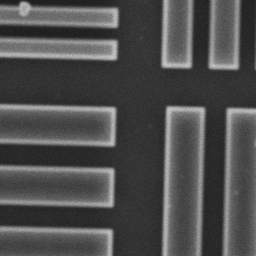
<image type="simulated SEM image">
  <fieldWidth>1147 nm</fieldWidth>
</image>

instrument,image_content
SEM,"groups of lines, slits or small figures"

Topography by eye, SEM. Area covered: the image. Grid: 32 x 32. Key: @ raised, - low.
---------------------@@@---@@@--
@@@@@@@@@@@@@@-------@@@--@@@@--
@@@@@@@@@@@@@@-------@@@--@@@@--
---------------------@@@--@@@@--
---------------------@@@--@@@@--
@@@@@@@@@@@@@@------@@@@--@@@@--
@@@@@@@@@@@@@@------@@@@--@@@@--
--------------------@@@@--@@@@--
--------------------------------
--------------------------------
--------------------------------
--------------------------------
--------------------------------
@@@@@@@-------------------------
@@@@@@@@@@@@@@-------@@@@----@@@
@@@@@@@@@@@@@@-------@@@@----@@@
@@@@@@@@@@@@@@-------@@@@----@@@
@@@@@@@@@@@@@@-------@@@@----@@@
---------------------@@@@---@@@@
---------------------@@@@---@@@@
---------------------@@@@---@@@@
@@@@@@@@@@@@@@-------@@@@---@@@@
@@@@@@@@@@@@@@-------@@@@---@@@@
@@@@@@@@@@@@@@-------@@@@---@@@@
@@@@@@@@@@@@@@-------@@@@---@@@@
------@@@@@@@@-------@@@@---@@@@
---------------------@@@@---@@@@
---------------------@@@@---@@@@
---------------------@@@@---@@@@
@@@@@@@@@@@@@@-------@@@@---@@@@
@@@@@@@@@@@@@@-------@@@@---@@@@
@@@@@@@@@@@@@@-------@@@@---@@@@